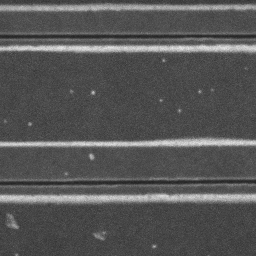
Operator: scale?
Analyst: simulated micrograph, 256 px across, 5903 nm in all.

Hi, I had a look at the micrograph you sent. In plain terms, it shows lines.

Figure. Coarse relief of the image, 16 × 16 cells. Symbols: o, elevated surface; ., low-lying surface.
................
oooooooooooooooo
oooooooooooooooo
................
................
................
................
................
................
oooooooooooooooo
oooooooooooooooo
oooooooooooooooo
................
................
................
................